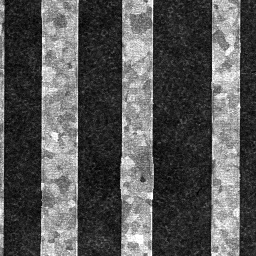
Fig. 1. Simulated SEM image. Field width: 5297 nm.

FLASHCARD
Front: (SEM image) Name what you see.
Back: one or a few lines or trenches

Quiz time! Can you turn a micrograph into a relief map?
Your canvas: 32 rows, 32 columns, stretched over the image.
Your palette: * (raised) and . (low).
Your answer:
.....*****.....****........***..
.....*****.....****........***..
.....*****.....****........***..
.....*****.....****........***..
.....*****.....****........***..
.....*****.....****........***..
.....*****.....****........***..
.....*****.....****........***..
.....*****.....****........***..
.....*****.....****........***..
.....*****.....****........***..
.....*****.....****........***..
.....*****.....****........***..
.....*****.....****........***..
.....*****.....****........***..
.....*****.....****........***..
.....*****.....****........***..
.....*****.....****........***..
.....*****.....****........***..
.....*****.....****........***..
.....*****.....****........***..
.....*****.....****........***..
.....*****.....****........***..
.....*****.....****........***..
.....*****.....****........***..
.....*****.....****........***..
.....*****.....****........***..
.....*****.....****........***..
.....*****.....****........***..
.....*****.....****........***..
.....*****.....****........***..
.....*****.....****.......****..